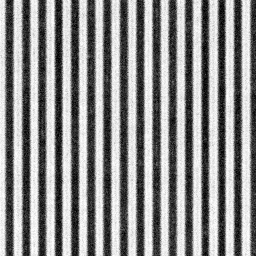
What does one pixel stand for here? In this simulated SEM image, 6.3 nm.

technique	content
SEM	parallel lines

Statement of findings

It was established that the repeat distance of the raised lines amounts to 103 nm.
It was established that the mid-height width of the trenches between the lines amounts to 52 nanometers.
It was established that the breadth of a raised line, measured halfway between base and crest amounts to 8.25 px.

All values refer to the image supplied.